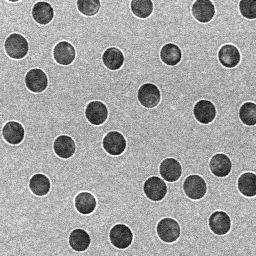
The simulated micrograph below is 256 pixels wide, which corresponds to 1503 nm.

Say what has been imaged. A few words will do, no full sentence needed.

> a regular array of holes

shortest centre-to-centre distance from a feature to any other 0.245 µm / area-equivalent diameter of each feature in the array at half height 0.139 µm